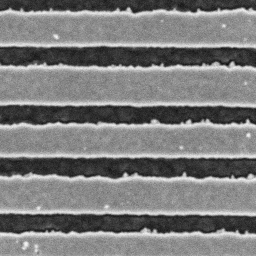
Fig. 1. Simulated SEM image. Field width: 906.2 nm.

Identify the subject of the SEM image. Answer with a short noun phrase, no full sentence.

lines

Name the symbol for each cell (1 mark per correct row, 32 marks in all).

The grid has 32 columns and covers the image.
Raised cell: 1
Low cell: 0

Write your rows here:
00000000000000000000000000000000
11101111111111111011111001111111
11111111111111111111111111111111
11111111111111111111111111111111
11111111111111111111111111111111
11111111111111111111111111111111
00000000000000000000000000000000
00000000000000000000000000000000
11111111111111111111111111111111
11111111111111111111111111111111
11111111111111111111111111111111
11111111111111111111111111111111
11111111111111111111111111111111
00000000000000000000000000000000
00000000000000000000000000000000
00110011111101110011101111100111
11111111111111111111111111111111
11111111111111111111111111111111
11111111111111111111111111111111
11111111111111111111111111111111
00000000000000000000000000000000
00000000000000000000000000000000
11111111111111111111111111111111
11111111111111111111111111111111
11111111111111111111111111111111
11111111111111111111111111111111
11111111111111111111111111111111
00000000000000000000000000000000
00000000000000000000000000000000
11111111111111111111111111111111
11111111111111111111111111111111
11111111111111111111111111111111